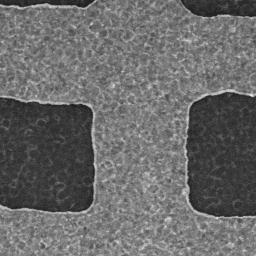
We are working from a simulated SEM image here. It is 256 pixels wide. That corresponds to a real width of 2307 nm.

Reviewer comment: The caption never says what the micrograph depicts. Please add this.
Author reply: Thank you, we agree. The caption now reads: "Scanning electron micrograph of holes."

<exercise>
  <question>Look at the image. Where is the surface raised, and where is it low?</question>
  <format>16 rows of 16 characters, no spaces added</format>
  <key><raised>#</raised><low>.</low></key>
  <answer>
############....
################
################
################
################
################
.....#######....
......######....
......######....
......######....
......######....
......######....
......######....
#############...
################
################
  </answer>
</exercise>